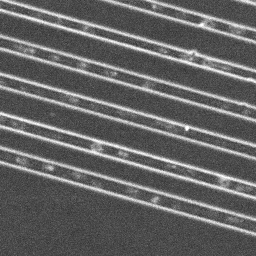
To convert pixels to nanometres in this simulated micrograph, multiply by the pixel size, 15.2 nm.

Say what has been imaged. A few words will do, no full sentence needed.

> parallel lines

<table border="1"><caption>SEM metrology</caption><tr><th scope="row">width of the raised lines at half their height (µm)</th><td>0.404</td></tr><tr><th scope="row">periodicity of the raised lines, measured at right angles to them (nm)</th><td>556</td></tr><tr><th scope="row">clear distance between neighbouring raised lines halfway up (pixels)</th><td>10.7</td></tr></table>